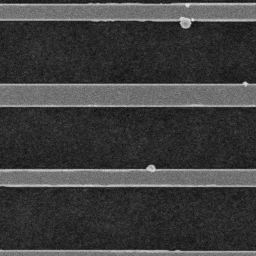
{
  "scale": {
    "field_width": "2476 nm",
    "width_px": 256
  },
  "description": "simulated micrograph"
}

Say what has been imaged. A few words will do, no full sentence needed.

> lines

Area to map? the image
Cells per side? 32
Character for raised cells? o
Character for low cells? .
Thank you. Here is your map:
............oooooo....oooooooooo
oooooooooooooooooooooooooooooooo
oooooooooooooooooooooooooooooooo
................................
................................
................................
................................
................................
................................
................................
..............................o.
oooooooooooooooooooooooooooooooo
oooooooooooooooooooooooooooooooo
................................
................................
................................
................................
................................
................................
................................
................................
oooooooooooooooooooooooooooooooo
oooooooooooooooooooooooooooooooo
................................
................................
................................
................................
................................
................................
................................
................................
oooooooooooooooooooooooooooooooo